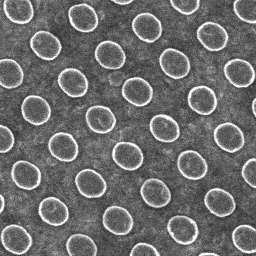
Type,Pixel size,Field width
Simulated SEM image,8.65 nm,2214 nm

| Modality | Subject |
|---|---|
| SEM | a regular array of raised bodies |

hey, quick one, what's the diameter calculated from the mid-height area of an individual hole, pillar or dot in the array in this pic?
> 248 nanometres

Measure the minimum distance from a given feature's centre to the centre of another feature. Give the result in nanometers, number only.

395